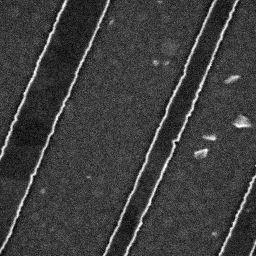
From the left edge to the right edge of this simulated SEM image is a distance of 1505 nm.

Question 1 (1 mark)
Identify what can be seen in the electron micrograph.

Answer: one or a few lines or trenches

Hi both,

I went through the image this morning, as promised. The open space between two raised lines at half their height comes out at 564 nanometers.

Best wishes